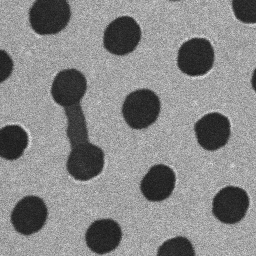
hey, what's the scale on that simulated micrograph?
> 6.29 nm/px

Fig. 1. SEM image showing a regular array of holes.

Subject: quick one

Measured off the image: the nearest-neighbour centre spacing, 473 nm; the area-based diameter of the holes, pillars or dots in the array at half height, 239 nanometres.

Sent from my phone